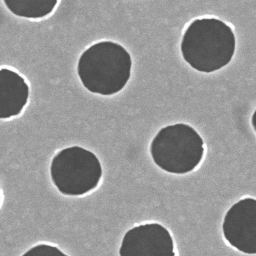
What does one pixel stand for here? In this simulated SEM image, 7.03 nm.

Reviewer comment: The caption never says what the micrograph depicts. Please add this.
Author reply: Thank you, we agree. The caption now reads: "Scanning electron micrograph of holes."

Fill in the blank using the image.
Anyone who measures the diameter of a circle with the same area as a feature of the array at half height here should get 371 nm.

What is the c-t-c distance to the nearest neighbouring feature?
0.738 µm